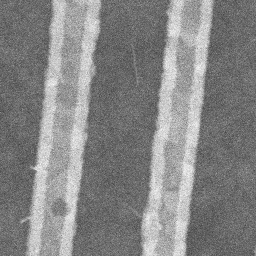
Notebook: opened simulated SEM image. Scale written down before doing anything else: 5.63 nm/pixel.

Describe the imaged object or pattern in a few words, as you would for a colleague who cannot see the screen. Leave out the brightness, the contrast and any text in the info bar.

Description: one or a few lines or trenches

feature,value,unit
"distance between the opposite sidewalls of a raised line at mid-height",185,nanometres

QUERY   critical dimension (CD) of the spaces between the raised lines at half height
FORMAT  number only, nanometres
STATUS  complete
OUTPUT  458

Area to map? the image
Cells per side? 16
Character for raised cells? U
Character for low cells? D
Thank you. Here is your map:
DDDDUUDDDDDUUDDD
DDDDUUDDDDDUUDDD
DDDDUUDDDDDUUDDD
DDDUUDDDDDDUUDDD
DDDUUDDDDDDUDDDD
DDDUUDDDDDUUDDDD
DDDUUDDDDDUUDDDD
DDDUUDDDDDUUDDDD
DDDUUDDDDDUUDDDD
DDDUUDDDDDUUDDDD
DDDUUDDDDDUUDDDD
DDDUUDDDDDUUDDDD
DDUUUDDDDDUUDDDD
DDUUDDDDDUUDDDDD
DDUUDDDDDUUDDDDD
DDUUDDDDDUUDDDDD